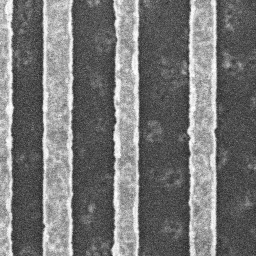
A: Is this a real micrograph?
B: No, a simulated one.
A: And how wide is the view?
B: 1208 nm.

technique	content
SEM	one or a few lines or trenches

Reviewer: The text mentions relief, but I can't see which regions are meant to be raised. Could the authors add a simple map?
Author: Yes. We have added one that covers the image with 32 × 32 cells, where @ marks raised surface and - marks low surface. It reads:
@-----@@@-----@@@-------@@@-----
@-----@@@-----@@@-------@@@-----
@-----@@@------@@-------@@@-----
@-----@@@------@@-------@@@-----
@-----@@@------@@-------@@@-----
@-----@@@------@@-------@@@-----
@-----@@@------@@-------@@@-----
@-----@@@------@@-------@@@-----
@-----@@@-----@@@-------@@@-----
@-----@@@------@@-------@@@-----
@-----@@@------@@-------@@@-----
@-----@@@------@@-------@@@-----
@-----@@@-----@@@-------@@@-----
@-----@@@------@@-------@@@-----
@-----@@@------@@-------@@@-----
@-----@@@------@@-------@@@-----
@-----@@@-----@@@-------@@@-----
@-----@@@-----@@@-------@@@-----
@-----@@@-----@@@-------@@@-----
@-----@@@------@@-------@@@-----
@-----@@@-----@@@-------@@@-----
@-----@@@------@@-------@@@-----
@-----@@@-----@@@-------@@@-----
@-----@@@------@@-------@@@-----
@-----@@@-----@@@-------@@@-----
@-----@@@-----@@@-------@@@-----
@-----@@@------@@-------@@@-----
@-----@@@------@@-------@@@-----
@-----@@@------@@-------@@@-----
@-----@@@-----@@@-------@@@-----
@-----@@@-----@@@-------@@@-----
@-----@@@-----@@@-------@@@-----